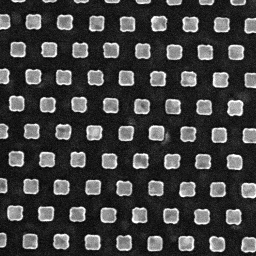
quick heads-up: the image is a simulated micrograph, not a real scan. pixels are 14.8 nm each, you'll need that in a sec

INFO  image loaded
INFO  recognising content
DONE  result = a regular array of raised bodies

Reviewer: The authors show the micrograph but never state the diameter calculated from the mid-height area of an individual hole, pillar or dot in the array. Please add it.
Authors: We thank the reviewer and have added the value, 0.232 microns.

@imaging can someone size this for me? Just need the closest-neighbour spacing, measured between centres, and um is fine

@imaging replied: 0.457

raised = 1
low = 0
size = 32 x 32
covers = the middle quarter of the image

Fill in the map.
00000000000000000000000000000000
00000000000000000000000000000000
11000011110000111000001110000111
11000011110000111000001110000111
11000011110000111000001110000111
00000000000000000000000000000000
00000000000000000000000000000000
00000000000000000000000000000000
00001000000000000000000000000000
00111100001110000011100000111000
00111100001110000011100001111000
00111000001110000011100000111000
00000000000000000000000000000000
00000000000000000000000000000000
00000000000000000000000000000000
10000000000000000000000000000000
11000011110000111000001110000111
11000011100000111000001110000111
10000011100000111000001110000111
00000000000000000000000000000000
00000000000000000000000000000000
00000000000000000000000000000000
00111000000000000000000000000000
00111000001110000011100001111000
00111000001110000111100001111000
00111000001110000111100001111000
00000000000000000000000000000000
00000000000000000000000000000000
00000000000000000000000000000000
10000011100000100000001100000000
10000011100001111000011110000111
10000111100001111000011110000111